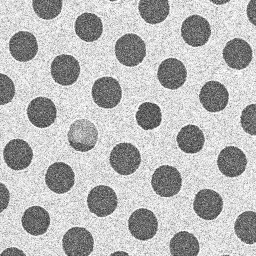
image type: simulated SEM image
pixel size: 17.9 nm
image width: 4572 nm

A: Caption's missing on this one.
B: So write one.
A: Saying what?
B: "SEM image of a regular array of holes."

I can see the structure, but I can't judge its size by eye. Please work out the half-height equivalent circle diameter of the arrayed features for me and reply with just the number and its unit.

554 nm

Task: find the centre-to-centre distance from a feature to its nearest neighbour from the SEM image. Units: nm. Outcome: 848